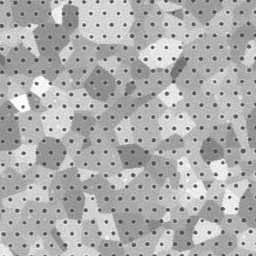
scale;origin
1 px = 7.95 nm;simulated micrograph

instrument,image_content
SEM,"a regular array of holes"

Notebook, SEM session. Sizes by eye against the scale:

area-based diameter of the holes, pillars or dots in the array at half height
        35.9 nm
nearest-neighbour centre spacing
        13.2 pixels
